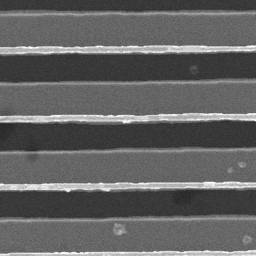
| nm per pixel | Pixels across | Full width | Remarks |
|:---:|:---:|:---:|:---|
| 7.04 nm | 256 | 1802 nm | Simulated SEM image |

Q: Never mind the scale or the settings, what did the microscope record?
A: lines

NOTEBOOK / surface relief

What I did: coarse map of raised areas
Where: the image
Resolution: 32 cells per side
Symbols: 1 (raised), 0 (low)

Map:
00000000000000000000000000000000
00000000000000000000000000000000
11111111111111111111111111111111
11111111111111111111111111111111
11111111111111111111111111111111
11111111111111111111111111111111
11111111111111111111111111000000
00000000000000000000000000000000
00000000000000000000000000000000
00000000000000000000000000000000
11111111111111111111111111111111
11111111111111111111111111111111
11111111111111111111111111111111
11111111111111111111111111111111
11111111111111111111111111111111
00000000000000000000000000000000
00000000000000000000000000000000
00000000000000000000000000000000
00000000000000000000000000000000
11111111111111111111111111111111
11111111111111111111111111111111
11111111111111111111111111111111
11111111111111111111111111111111
11111111111111111111111111111110
00000000000000000000000000000000
00000000000000000000000000000000
00000000000000000000000000000000
11111111111111111111111111111111
11111111111111111111111111111111
11111111111111111111111111111111
11111111111111111111111111111111
11111111111111111111111111111111